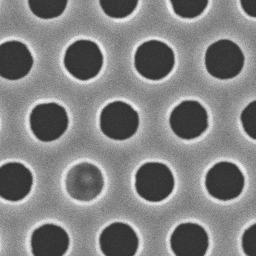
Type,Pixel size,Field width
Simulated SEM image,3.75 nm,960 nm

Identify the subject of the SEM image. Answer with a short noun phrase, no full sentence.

a regular array of holes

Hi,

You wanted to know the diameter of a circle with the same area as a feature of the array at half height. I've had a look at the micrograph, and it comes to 146 nm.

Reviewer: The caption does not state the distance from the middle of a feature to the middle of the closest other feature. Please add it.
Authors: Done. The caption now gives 0.26 µm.